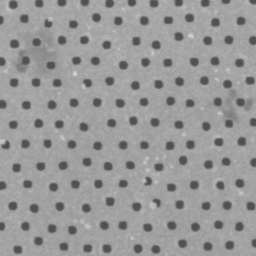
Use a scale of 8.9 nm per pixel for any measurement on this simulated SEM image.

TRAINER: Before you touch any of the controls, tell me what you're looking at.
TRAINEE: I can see a regular array of holes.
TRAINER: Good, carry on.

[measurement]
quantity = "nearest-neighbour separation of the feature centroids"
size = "183 nm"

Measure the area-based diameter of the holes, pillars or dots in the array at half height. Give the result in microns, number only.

0.0819